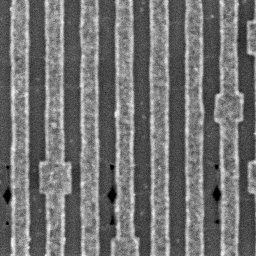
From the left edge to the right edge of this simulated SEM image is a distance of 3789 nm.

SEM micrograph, wiring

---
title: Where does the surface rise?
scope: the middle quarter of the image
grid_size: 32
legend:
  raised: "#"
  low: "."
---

.....###.....####.....####.....#
.....###.....####.....####.....#
....####.....####.....####.....#
....####.....####.....####.....#
....####.....####.....####.....#
.....###.....####.....####.....#
.....###.....####.....####.....#
.....###.....####.....####.....#
.....###.....####.....####.....#
.....###.....####.....####.....#
.....###......###.....####.....#
.....###......###.....####.....#
.....###.....####.....####.....#
.....###.....####.....####.....#
.....###.....####.....####.....#
.....###.....####.....####.....#
.....###.....####.....####.....#
.....###......###.....####.....#
.....###......###.....####.....#
.....###......###.....####.....#
.....###......###.....####.....#
.....###......###.....####.....#
.....###......###.....####.....#
.....###.....####.....####.....#
.....###.....####.....####.....#
#....###.....####.....####.....#
#....###.....####.....####.....#
#....###.....####.....####.....#
#....###.....####.....####.....#
#....###......###.....####.....#
#....###......###.....####.....#
#....###......###.....####.....#